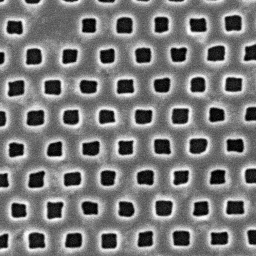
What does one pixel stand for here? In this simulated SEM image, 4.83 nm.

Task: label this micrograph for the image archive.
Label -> a regular array of holes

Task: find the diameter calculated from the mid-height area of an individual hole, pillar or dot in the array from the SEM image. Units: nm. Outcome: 85.3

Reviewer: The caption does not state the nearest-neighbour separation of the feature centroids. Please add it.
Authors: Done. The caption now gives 0.169 µm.